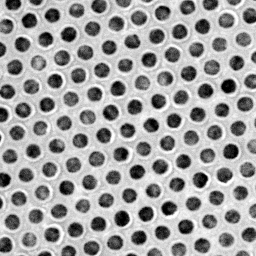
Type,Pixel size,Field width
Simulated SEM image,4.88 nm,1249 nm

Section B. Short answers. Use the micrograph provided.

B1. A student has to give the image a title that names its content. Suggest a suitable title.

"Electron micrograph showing a regular array of holes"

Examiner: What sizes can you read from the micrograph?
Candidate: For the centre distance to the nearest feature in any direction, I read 116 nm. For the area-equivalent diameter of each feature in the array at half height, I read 81.8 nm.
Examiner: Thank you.